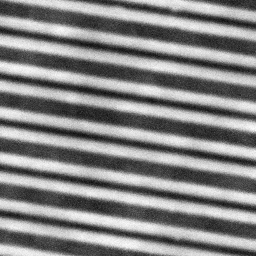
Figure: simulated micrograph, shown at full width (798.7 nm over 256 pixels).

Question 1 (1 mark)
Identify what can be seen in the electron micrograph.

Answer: parallel lines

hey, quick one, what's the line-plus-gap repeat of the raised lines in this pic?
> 70.1 nm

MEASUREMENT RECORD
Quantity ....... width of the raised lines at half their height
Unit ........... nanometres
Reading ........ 24.6